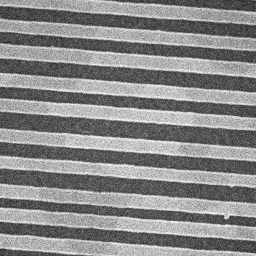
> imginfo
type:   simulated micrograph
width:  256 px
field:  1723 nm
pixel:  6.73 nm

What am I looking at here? parallel lines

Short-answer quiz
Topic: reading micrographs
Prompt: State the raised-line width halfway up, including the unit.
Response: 84.7 nm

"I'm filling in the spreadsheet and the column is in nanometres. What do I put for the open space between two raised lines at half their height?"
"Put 98.2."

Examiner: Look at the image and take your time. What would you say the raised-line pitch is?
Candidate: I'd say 0.181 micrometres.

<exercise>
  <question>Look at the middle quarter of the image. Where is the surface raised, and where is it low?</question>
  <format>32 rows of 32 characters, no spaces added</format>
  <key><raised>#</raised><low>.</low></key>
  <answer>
.............#.#################
..........................##..##
................................
................................
###########.....................
######################.##.......
################################
............####################
.........................#######
................................
########........................
##################..............
################################
........########################
.....................###########
....###.........................
....###.........................
................................
##########..#...................
##########################......
.###############################
..............##################
...........................#####
................................
##..............................
################................
############################....
........########################
...................#############
................................
................................
................................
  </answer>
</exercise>